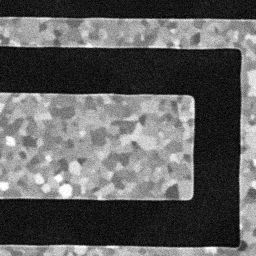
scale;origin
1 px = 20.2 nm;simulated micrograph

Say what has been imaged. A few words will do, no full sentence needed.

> groups of lines, slits or small figures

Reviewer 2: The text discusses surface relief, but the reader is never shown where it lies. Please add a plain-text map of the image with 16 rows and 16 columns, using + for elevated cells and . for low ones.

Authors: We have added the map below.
................
++++++++++++++++
++++++++++++++++
...............+
...............+
...............+
++++++++++++...+
++++++++++++...+
++++++++++++...+
++++++++++++...+
++++++++++++...+
++++++++++++...+
...............+
...............+
...............+
++++++++++....++